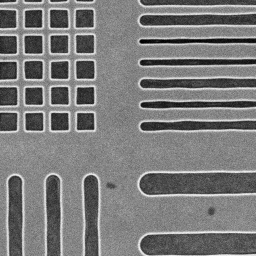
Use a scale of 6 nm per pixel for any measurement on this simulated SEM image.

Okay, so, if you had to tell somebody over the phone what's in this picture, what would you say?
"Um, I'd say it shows groups of lines, slits or small figures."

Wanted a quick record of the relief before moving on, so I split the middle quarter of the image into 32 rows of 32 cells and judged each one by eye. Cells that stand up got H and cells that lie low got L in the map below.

LHHLLLLLHHHHHHHHHHHHHHHHHHHHHHHH
LHHLLLLLHHHHHHHHHHHHHHHHHHHHHHHH
LHHLLLLLHHHHHHHHHHHHHHHHHHHHHHHH
LHHLLLLLHHHHHHHHHHHHHHHHHHHHHHHH
HHHHHHHHHHHHHHHHHHHLLLLLLLLLLLLL
HHHHHHHHHHHHHHHHHHHLLLLLLLLLLLLL
LHHLLLLLHHHHHHHHHHHHHHHHHHHHHHHH
LHHLLLLLHHHHHHHHHHHHHHHHHHHHHHHH
LHHLLLLLHHHHHHHHHHHHHHHHHHHHHHHH
LHHLLLLLHHHHHHHHHHHHLLLLLLLLLLLL
HHHHHHHHHHHHHHHHHHHLLLLLLLLLLLLL
HHHHHHHHHHHHHHHHHHHHHHHHHHHHHHHH
LHHLLLLHHHHHHHHHHHHHHHHHHHHHHHHH
LHHLLLLLHHHHHHHHHHHHHHHHHHHHHHHH
LHHLLLLLHHHHHHHHHHHHLLLLLLLLLLLL
LHHLLLLLHHHHHHHHHHHLLLLLLLLLLLLL
LHHLLLLLHHHHHHHHHHHLLLLLLLLLLLLL
HHHHHHHHHHHHHHHHHHHHHHHHHHHHHHHH
HHHHHHHHHHHHHHHHHHHHHHHHHHHHHHHH
HHHHHHHHHHHHHHHHHHHHHHHHHHHHHHHH
HHHHHHHHHHHHHHHHHHHHHHHHHHHHHHHH
HHHHHHHHHHHHHHHHHHHHHHHHHHHHHHHH
HHHHHHHHHHHHHHHHHHHHHHHHHHHHHHHH
HHHHHHHHHHHHHHHHHHHHHHHHHHHHHHHH
HHHHHHHHHHHHHHHHHHHHHHHHHHHHHHHH
HHHHHHHHHHHHHHHHHHHHHHHHHHHHHHHH
HHHHHHHHHHHHHHHHHHHHHHHHHHHHHHHH
HHHHHHHHHHHHHHHHHHHHLLLLLLLLLLLL
HHHHHLLLHHHHHHHHHHHLLLLLLLLLLLLL
HHHHHLLLLHHHHHHHHHHLLLLLLLLLLLLL
HHHHHLLLLHHHHHHHHHHLLLLLLLLLLLLL
HHHHHLLLLHHHHHHHHHHLLLLLLLLLLLLL